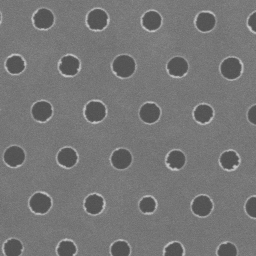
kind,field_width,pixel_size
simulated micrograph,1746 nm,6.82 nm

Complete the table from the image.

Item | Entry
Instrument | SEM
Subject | a regular array of holes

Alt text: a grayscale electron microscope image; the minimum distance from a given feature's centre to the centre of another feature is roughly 360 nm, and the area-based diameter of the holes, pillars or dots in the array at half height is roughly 137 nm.